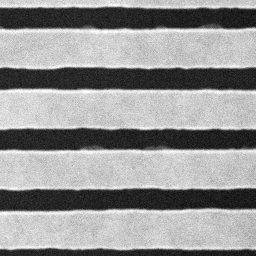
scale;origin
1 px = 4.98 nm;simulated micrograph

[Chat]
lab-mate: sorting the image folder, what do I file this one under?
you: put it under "lines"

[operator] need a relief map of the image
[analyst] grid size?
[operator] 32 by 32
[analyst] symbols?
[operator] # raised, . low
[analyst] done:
################################
................................
................................
................................
################################
################################
################################
################################
...####...........##...#........
................................
................................
################################
################################
################################
################################
################################
................................
................................
................................
################################
################################
################################
################################
#################...##########..
................................
................................
################################
################################
################################
################################
################################
................................